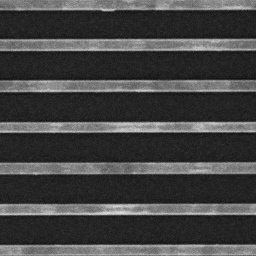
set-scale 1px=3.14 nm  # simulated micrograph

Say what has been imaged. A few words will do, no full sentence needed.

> parallel lines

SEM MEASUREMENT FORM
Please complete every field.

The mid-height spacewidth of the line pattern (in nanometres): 96.1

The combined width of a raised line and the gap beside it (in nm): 129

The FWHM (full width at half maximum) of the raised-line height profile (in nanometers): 31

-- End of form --